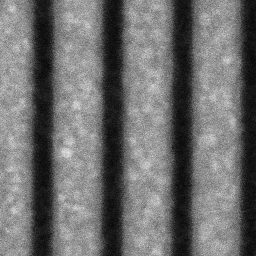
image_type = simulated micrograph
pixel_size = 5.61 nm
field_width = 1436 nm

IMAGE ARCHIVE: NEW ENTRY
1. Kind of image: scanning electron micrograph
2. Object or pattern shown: one or a few lines or trenches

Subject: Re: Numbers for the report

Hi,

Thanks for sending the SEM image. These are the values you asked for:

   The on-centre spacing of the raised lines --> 0.388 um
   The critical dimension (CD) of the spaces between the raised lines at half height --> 246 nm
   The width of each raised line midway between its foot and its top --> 142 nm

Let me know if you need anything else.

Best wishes